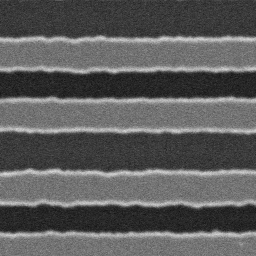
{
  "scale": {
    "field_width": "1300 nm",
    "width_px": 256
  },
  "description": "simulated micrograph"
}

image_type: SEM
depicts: lines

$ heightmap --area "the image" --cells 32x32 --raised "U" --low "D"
DDDDDDDDDDDDDDDDDDDDDDDDDDDDDDDD
DDDDDDDDDDDDDDDDDDDDDDDDDDDDDDDD
DDDDDDDDDDDDDDDDDDDDDDDDDDDDDDDD
DDDDDDDDDDDDDDDDDDDDDDDDDDDDDDDD
DDDDDDDDDDDDDDDDDDDDDDDDDDDDDDDD
UUUUUUUUUUUUUUUUUUUUUUUUUUUUUUUU
UUUUUUUUUUUUUUUUUUUUUUUUUUUUUUUU
UUUUUUUUUUUUUUUUUUUUUUUUUUUUUUUU
UUUUUUUUUUUUUUUUUUUUUUUUUUUUUUUU
DDDDDDDDDDDDDDDDDDDDDDDDDDDDDDDD
DDDDDDDDDDDDDDDDDDDDDDDDDDDDDDDD
DDDDDDDDDDDDDDDDDDDDDDDDDDDDDDDD
UUUUUUUUUUUUUUUUUUUUUUUUUUUUUUUU
UUUUUUUUUUUUUUUUUUUUUUUUUUUUUUUU
UUUUUUUUUUUUUUUUUUUUUUUUUUUUUUUU
UUUUUUUUUUUUUUUUUUUUUUUUUUUUUUUU
DDDUUUUUDDDDDDUUDDDUDUUDDDDUDUUU
DDDDDDDDDDDDDDDDDDDDDDDDDDDDDDDD
DDDDDDDDDDDDDDDDDDDDDDDDDDDDDDDD
DDDDDDDDDDDDDDDDDDDDDDDDDDDDDDDD
DDDDDDDDDDDDDDDDDDDDDDDDDDDDDDDD
DDUUUUUUUUUUDDDUDDUUUUUUUDDUUUUU
UUUUUUUUUUUUUUUUUUUUUUUUUUUUUUUU
UUUUUUUUUUUUUUUUUUUUUUUUUUUUUUUU
UUUUUUUUUUUUUUUUUUUUUUUUUUUUUUUU
UUUUUDUUUUUUUDDUUUUUUUDUUUUUUUUD
DDDDDDDDDDDDDDDDDDDDDDDDDDDDDDDD
DDDDDDDDDDDDDDDDDDDDDDDDDDDDDDDD
DDDDDDDDDDDDDDDDDDDDDDDDDDDDDDDD
UUUUUUUUUUUUUUUUUUUUUUUUUUUUUUUU
UUUUUUUUUUUUUUUUUUUUUUUUUUUUUUUU
UUUUUUUUUUUUUUUUUUUUUUUUUUUUUUUU